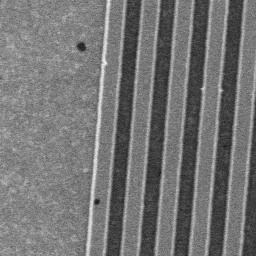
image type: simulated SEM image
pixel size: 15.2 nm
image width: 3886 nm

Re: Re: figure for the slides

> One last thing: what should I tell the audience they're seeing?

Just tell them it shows parallel lines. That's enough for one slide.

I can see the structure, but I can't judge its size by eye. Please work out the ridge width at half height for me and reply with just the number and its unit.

278 nanometers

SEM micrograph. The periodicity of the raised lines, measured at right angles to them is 515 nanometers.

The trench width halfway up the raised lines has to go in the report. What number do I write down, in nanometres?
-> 236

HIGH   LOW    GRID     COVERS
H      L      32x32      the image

LLLLLLLLLLLLLHHHLLHHLLHHLLHHLLHH
LLLLLLLLLLLLLHHHLLHHLLHHLLHHLLHH
LLLLLLLLLLLLLHHHLLHHLLHHLLHHLLHH
LLLLLLLLLLLLLHHLLLHHLLHHLLHHLLHH
LLLLLLLLLLLLLHHLLHHHLLHHLLHHLLHH
LLLLLLLLLLLLLHHLLHHHLLHHLLHHLLHH
LLLLLLLLLLLLLHHLLHHLLHHHLLHHLLHH
LLLLLLLLLLLLLHHLLHHLLHHHLLHHLLHH
LLLLLLLLLLLLLHHLLHHLLHHHLLHHLLHH
LLLLLLLLLLLLLHHLLHHLLHHLLHHHLLHH
LLLLLLLLLLLLLHHLLHHLLHHLLHHHLLHH
LLLLLLLLLLLLLHHLLHHLLHHLLHHHLLHH
LLLLLLLLLLLLHHHLLHHLLHHLLHHLLLHH
LLLLLLLLLLLLHHHLLHHLLHHLLHHLLHHH
LLLLLLLLLLLLHHHLLHHLLHHLLHHLLHHH
LLLLLLLLLLLLHHLLHHHLLHHLLHHLLHHH
LLLLLLLLLLLLHHLLHHHLLHHLLHHLLHHL
LLLLLLLLLLLLHHLLHHHLLHHLLHHLLHHL
LLLLLLLLLLLLHHLLHHLLHHHLLHHLLHHL
LLLLLLLLLLLLHHLLHHLLHHHLLHHLLHHL
LLLLLLLLLLLLHHLLHHLLHHHLLHHLLHHL
LLLLLLLLLLLLHHLLHHLLHHLLHHHLLHHL
LLLLLLLLLLLLHHLLHHLLHHLLHHHLLHHL
LLLLLLLLLLLLHHLLHHLLHHLLHHHLLHHL
LLLLLLLLLLLHHHLLHHLLHHLLHHLLHHHL
LLLLLLLLLLLHHHLLHHLLHHLLHHLLHHHL
LLLLLLLLLLLHHHLLHHLLHHLLHHLLHHHL
LLLLLLLLLLLHHLLHHHLLHHLLHHLLHHHL
LLLLLLLLLLLHHLLHHHLLHHLLHHLLHHLL
LLLLLLLLLLLHHLLHHHLLHHLLHHLLHHLL
LLLLLLLLLLLHHLLHHLLHHHLLHHLLHHLL
LLLLLLLLLLLHHLLHHLLHHHLLHHLLHHLL